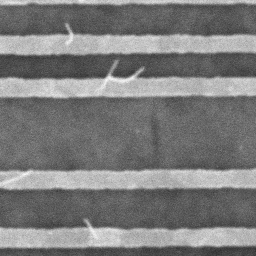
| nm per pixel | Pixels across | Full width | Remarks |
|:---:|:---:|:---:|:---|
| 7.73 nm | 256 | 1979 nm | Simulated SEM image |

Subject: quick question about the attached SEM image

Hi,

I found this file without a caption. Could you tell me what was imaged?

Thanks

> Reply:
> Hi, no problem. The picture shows lines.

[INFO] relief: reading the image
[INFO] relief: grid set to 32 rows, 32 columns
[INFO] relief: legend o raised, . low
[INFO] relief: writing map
................................
................................
................................
................................
....o.oooooo.o..o.o..ooo.....ooo
oooooooooooooooooooooooooooooooo
oooooooooooooooooooooooo.oo....o
................................
................................
................................
oooooooooooooooooooooooooooooooo
oooooooooooooooooooooooooooooooo
................................
................................
................................
................................
................................
................................
................................
................................
................................
.ooooooooooooo.ooooooooooooooooo
oooooooooooooooooooooooooooooooo
oooooooooooooooooooo.o..........
................................
................................
................................
................................
................................
oooooooooooooooooooooooooooooooo
oooooooooooooooooooooooooooooooo
................................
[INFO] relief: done